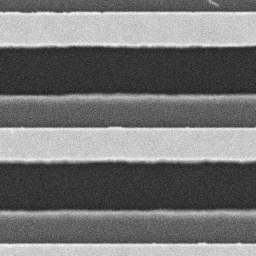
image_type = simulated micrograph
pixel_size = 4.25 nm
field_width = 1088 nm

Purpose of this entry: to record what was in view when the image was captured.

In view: lines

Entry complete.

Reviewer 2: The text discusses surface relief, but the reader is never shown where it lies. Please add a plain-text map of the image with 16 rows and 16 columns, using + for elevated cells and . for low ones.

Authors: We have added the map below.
++++++++++++++++
++++++++++++++++
++++++++++++++++
................
................
................
++++++++++++++++
++++++++++++++++
++++++++++++++++
++++++++++++++++
................
................
................
++++++++++++++++
++++++++++++++++
++++++++++++++++